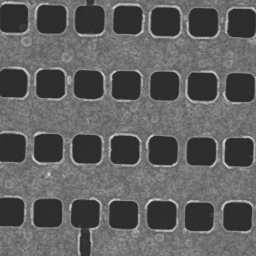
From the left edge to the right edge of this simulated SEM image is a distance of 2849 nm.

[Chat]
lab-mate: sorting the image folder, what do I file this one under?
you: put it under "a regular array of holes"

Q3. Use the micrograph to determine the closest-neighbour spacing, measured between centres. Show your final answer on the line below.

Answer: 423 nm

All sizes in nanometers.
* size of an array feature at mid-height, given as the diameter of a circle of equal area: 354